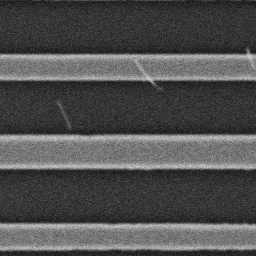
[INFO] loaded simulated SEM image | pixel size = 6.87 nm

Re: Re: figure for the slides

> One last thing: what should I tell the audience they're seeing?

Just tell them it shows lines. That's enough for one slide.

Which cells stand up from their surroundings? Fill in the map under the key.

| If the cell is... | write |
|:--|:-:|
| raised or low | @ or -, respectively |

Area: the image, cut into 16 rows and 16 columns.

----------------
----------------
----------------
@@@@@@@@@@@@@@@@
@@@@@@@@@@@@@@@@
----------------
----------------
----------------
--------@----@-@
@@@@@@@@@@@@@@@@
@@@@@@@@@@@@@@@@
----------------
----------------
----------------
@@@@@@@@@@@@@@@@
@@@@@@@@@@@@@@@@